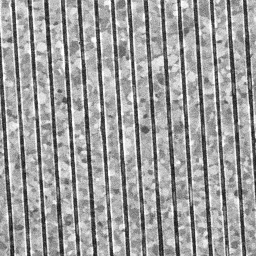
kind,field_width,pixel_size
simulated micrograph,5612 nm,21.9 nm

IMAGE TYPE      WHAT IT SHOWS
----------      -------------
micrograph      parallel lines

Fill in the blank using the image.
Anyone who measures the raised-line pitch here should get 16.5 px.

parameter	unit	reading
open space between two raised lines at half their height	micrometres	0.107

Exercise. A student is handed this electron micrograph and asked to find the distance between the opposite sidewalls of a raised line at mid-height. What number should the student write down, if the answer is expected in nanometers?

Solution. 252